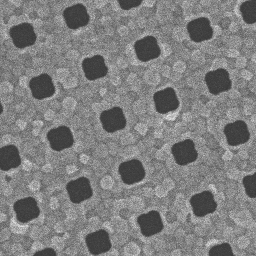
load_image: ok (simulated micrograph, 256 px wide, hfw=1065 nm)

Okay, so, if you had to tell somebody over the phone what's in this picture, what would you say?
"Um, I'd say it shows a regular array of holes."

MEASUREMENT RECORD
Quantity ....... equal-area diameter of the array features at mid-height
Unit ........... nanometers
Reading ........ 106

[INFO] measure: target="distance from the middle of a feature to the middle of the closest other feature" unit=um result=0.228